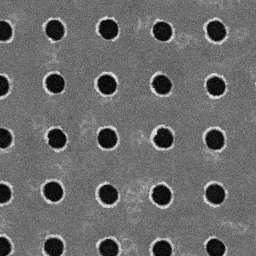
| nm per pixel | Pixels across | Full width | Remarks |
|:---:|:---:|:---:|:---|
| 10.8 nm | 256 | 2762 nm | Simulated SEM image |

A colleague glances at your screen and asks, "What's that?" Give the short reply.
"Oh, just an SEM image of a regular array of holes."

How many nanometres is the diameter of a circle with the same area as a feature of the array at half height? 214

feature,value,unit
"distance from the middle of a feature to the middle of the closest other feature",574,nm